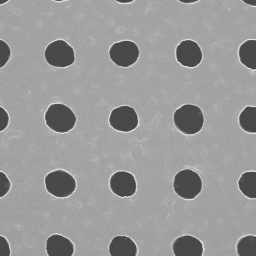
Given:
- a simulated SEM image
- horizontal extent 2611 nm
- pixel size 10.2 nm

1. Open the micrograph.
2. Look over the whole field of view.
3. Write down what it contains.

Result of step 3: a regular array of holes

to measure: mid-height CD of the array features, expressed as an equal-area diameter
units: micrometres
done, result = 0.285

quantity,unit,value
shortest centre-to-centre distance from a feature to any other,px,64.2